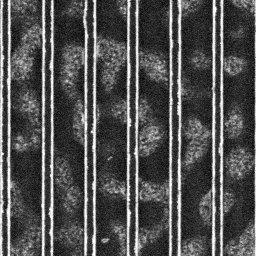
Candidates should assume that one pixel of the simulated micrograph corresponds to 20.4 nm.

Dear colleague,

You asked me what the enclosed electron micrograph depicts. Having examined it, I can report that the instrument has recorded parallel lines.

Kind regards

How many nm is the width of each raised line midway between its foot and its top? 173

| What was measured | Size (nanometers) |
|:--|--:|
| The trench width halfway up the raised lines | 690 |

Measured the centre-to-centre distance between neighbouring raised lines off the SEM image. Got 865 nm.